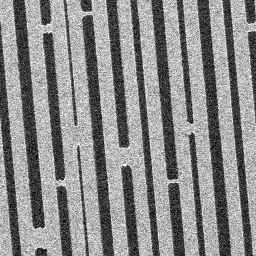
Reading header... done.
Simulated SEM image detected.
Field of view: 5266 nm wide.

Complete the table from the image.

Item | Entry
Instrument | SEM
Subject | parallel lines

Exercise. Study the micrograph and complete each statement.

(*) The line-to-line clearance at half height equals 228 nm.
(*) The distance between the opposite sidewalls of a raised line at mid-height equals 279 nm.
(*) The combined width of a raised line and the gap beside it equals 475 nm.